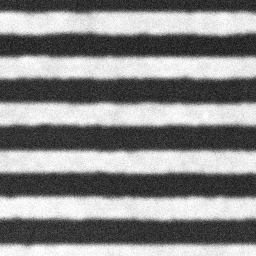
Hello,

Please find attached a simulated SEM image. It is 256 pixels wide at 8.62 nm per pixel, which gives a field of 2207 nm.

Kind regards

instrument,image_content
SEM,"lines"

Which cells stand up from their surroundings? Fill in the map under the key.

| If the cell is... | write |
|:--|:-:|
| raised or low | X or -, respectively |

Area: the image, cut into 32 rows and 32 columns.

--------------------------------
--------------------------------
XXXXXXXXXXXXXXXXXXXXXXXXXXXXXXXX
XXXXXXXXXXXXXXXXXXXXXXXXXXXXXXXX
--------------------------------
--------------------------------
--------------------------------
XXXXXXXXXXXXXXXXXXXXXXXXXXXXXXXX
XXXXXXXXXXXXXXXXXXXXXXXXXXXXXXXX
XXXXXXXXXXXXXXXXXXXXXXXXXXXXXXXX
--------------------------------
--------------------------------
--------------------------------
XXXXXXXXXXXXXXXXXXXXXXXXXXXXXXXX
XXXXXXXXXXXXXXXXXXXXXXXXXXXXXXXX
XX-XX----XX-XXXXXXXXX---X-----XX
--------------------------------
--------------------------------
--------------------------------
XXXXXXXXXXXXXXXXXXXXXXXXXXXXXXXX
XXXXXXXXXXXXXXXXXXXXXXXXXXXXXXXX
---------------XXXXXX----XXXXXXX
--------------------------------
--------------------------------
--------------------------------
XXXXXXXXXXXXXXXXXXXXXXXXXXXXXXXX
XXXXXXXXXXXXXXXXXXXXXXXXXXXXXXXX
--------------------------------
--------------------------------
--------------------------------
--------------------------------
XXXXXXXXXXXXXXXXXXXXXXXXXXXXXXXX